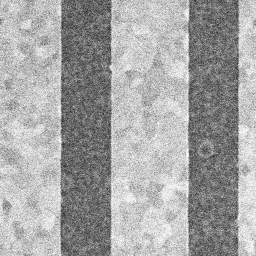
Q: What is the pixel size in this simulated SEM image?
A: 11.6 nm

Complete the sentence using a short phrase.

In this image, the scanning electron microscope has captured one or a few lines or trenches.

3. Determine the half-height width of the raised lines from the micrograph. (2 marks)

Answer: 75.9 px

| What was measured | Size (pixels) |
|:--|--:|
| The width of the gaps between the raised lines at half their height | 50.7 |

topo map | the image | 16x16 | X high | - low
XXXX---XXXXX---X
XXXX---XXXXX---X
XXXX---XXXXX---X
XXXX---XXXXX---X
XXXX---XXXXX---X
XXXX---XXXXX---X
XXXX---XXXXX---X
XXXX---XXXXX---X
XXXX---XXXXX---X
XXXX---XXXXX---X
XXXX---XXXXX---X
XXXX---XXXXX---X
XXXX---XXXXX---X
XXXX---XXXXX---X
XXXX---XXXXX---X
XXXX---XXXXX---X